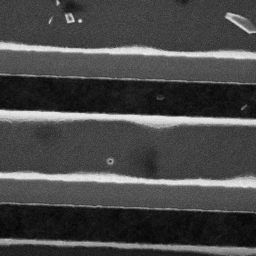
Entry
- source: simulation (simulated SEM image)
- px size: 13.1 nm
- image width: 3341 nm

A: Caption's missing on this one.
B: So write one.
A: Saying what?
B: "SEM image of lines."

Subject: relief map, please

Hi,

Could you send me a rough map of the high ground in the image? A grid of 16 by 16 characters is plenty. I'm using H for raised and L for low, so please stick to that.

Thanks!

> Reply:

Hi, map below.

LLLLLLLLLLLLLLLL
LLLLLLLLLLLLLLLL
LLLLLLLLLLLLLLLL
HHHHHHHHHHHHHLLL
HHHHHHHHHHHHHHHH
HHHHHHHHHHHHHHHH
HHHHHHHHHHHHHHHH
LLLLLLLLLLLLLLLH
LLLLLLLLLLLLLLLL
LLLLLLLLLLLLLLLL
LLLLLLLLLLLLLLLL
HHHHHHHHHHHHLLLL
HHHHHHHHHHHHHHHH
HHHHHHHHHHHHHHHH
HHHHHHHHHHHHHHHH
LLLLLLLLLLLLLHHH